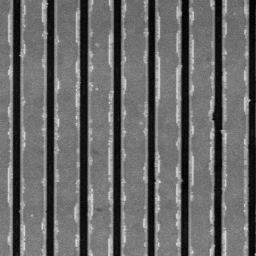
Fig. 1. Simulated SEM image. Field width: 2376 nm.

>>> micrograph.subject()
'parallel lines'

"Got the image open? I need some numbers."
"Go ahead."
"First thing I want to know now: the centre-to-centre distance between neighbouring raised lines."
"312 nanometres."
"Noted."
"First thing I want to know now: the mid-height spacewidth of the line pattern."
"91.7 nm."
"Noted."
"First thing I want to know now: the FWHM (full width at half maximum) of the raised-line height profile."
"0.222 micrometres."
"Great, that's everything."